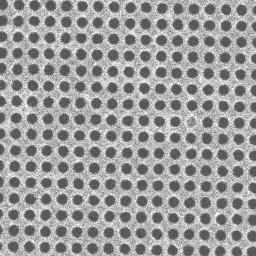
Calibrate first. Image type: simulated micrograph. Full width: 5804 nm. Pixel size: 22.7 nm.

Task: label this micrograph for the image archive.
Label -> a regular array of holes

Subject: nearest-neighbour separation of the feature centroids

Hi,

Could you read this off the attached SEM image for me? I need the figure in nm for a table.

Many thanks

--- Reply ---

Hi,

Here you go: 356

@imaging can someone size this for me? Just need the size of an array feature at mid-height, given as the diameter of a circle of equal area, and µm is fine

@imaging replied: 0.258